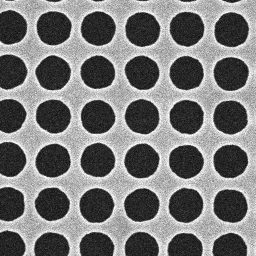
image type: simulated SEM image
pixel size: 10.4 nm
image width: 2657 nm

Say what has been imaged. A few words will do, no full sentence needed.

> a regular array of holes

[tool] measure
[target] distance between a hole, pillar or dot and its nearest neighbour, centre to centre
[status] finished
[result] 454 nm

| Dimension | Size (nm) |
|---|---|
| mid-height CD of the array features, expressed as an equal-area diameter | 360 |